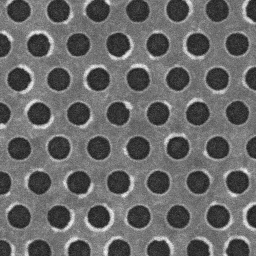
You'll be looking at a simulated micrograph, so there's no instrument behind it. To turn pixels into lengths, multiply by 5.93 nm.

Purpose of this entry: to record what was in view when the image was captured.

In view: a regular array of holes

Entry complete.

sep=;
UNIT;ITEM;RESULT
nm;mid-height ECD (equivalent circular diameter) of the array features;144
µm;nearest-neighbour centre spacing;0.234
